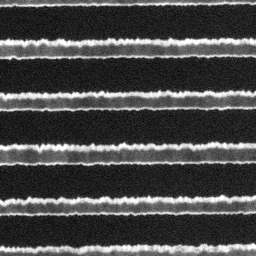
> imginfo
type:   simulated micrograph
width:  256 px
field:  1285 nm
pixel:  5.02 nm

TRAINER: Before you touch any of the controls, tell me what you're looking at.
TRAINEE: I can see lines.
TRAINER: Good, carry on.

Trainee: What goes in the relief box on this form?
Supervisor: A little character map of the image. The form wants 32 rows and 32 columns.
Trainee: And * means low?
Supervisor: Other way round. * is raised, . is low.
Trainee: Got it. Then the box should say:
*********************.***.*....*
................................
................................
................................
................................
********************************
********************************
................................
................................
................................
................................
................................
********************************
*****************************.**
................................
................................
................................
................................
**********.*********************
********************************
**.****...****..................
................................
................................
................................
................................
********************************
********************************
................................
................................
................................
................................
********************************